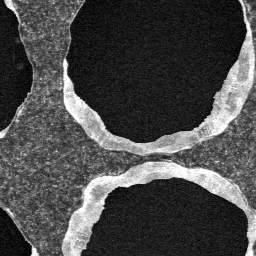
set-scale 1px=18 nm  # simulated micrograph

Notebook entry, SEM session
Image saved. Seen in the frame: holes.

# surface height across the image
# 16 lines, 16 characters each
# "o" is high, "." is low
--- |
.oooo..........o
.ooo...........o
.ooo...........o
..oo...........o
..oo...........o
..ooo..........o
.oooo.........oo
.oooo.........oo
oooooo.......ooo
oooooooo..oooooo
oooooooooooooooo
oooooooo......oo
oooooo.........o
.ooooo..........
.oooo...........
..oo............